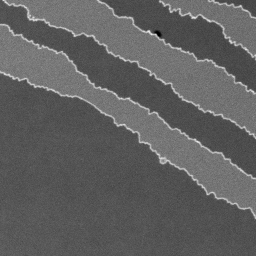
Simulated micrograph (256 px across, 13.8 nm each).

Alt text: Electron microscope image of one or a few lines or trenches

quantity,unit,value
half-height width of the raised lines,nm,483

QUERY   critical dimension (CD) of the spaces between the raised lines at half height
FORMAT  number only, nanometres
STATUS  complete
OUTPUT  452